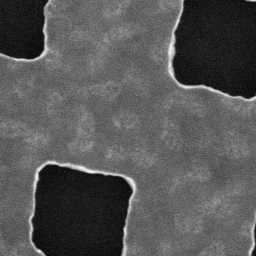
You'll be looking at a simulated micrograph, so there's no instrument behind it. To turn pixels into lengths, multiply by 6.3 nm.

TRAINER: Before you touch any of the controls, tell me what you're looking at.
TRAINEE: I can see holes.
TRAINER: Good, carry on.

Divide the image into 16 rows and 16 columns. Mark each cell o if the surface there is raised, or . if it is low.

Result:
...oooooooo.....
...oooooooo.....
...oooooooo.....
..ooooooooo.....
ooooooooooo.....
ooooooooooooo...
oooooooooooooooo
oooooooooooooooo
oooooooooooooooo
oooooooooooooooo
ooo..ooooooooooo
oo......oooooooo
oo......oooooooo
oo......oooooooo
oo......oooooooo
oo......oooooooo